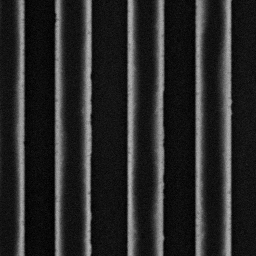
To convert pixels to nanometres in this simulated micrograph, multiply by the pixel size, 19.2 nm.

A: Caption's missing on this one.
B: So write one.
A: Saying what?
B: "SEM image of lines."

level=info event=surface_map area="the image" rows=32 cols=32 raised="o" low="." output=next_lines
ooo....oooo.....oooo.....oooo...
ooo....oooo.....oooo.....oooo...
ooo....oooo.....oooo.....oooo...
ooo....oooo.....oooo.....oooo...
ooo....oooo.....oooo.....oooo...
ooo....oooo.....oooo.....oooo...
ooo....oooo.....oooo.....oooo...
ooo....oooo.....oooo.....oooo...
ooo....oooo.....oooo.....oooo...
ooo....oooo.....oooo.....oooo...
ooo....oooo.....oooo.....oooo...
ooo....oooo.....oooo.....oooo...
ooo....oooo.....oooo.....oooo...
ooo....oooo.....oooo.....oooo...
ooo....oooo.....oooo.....oooo...
ooo....oooo.....oooo.....oooo...
ooo....oooo.....oooo.....oooo...
ooo....oooo.....oooo.....oooo...
ooo....oooo.....oooo.....oooo...
ooo....oooo.....oooo.....oooo...
ooo....oooo.....oooo.....oooo...
ooo....oooo.....oooo.....oooo...
ooo....oooo.....oooo.....oooo...
ooo....oooo.....oooo.....oooo...
ooo....oooo.....oooo.....oooo...
ooo....oooo.....oooo.....oooo...
ooo....oooo.....oooo.....oooo...
ooo....oooo.....oooo.....oooo...
ooo....oooo.....oooo.....oooo...
ooo....oooo.....oooo.....oooo...
ooo....oooo.....oooo.....oooo...
ooo....oooo.....oooo.....oooo...